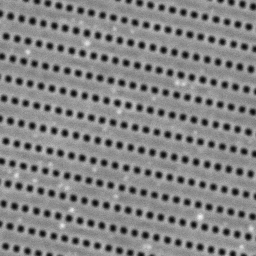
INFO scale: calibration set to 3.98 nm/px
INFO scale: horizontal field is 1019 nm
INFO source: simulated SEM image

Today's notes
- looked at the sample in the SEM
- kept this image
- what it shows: a regular array of holes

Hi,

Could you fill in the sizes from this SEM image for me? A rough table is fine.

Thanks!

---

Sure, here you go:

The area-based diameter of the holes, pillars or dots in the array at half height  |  30.2 nanometers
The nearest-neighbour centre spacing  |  43.5 nm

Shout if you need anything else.